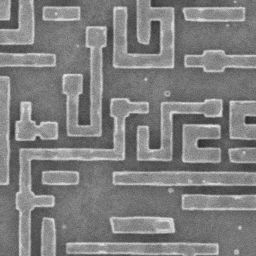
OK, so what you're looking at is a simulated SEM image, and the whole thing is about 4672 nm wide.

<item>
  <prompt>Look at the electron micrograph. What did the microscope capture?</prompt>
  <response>wiring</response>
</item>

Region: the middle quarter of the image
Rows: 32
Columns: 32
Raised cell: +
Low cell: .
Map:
.......++...+++++++++++++++...++
.......++.......................
.......++.......................
++++...++.......................
++++...++.......................
++++...++.......................
++++...++.......................
++++...++.......................
.+++...++.......................
.+++...++...+++++...............
.++....++...+++++++++....+++++++
.++....++...+++++++++....+++++++
.++....++...++++.........++.....
.++....++...+++..........++.....
.++....++....++..........++.....
.+++..+++....++..........++...++
.++++++++....++...+++....++...++
.++++++++....++...+++....++...++
.............++...+++....++...++
.............++...+++....++...++
.............++...+++...+++...++
++++++++++..+++...++++..+++...++
+++++++++++++++...+++++++++...++
+++++++++++++++...+++++++++...++
...............................+
................................
................................
++++........++++++++++++++++++++
++++........++++++++++++++++++++
++++........++++++++++++++++++++
................................
................................